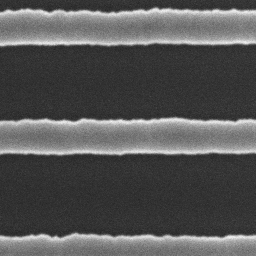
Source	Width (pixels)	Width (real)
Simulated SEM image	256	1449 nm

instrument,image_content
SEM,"lines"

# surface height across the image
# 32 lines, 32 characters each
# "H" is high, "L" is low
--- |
LLLLLLLLLLLLLLLLLLLLLLLLLLLLLLLL
HHHHHHHHHHHHLLLHHHHHHHHHHHHHHHHH
HHHHHHHHHHHHHHHHHHHHHHHHHHHHHHHH
HHHHHHHHHHHHHHHHHHHHHHHHHHHHHHHH
HHHHHHHHHHHHHHHHHHHHHHHHHHHHHHHH
HHHLHHHLHLLLHHHHHLLLLLLLLLHLLLLL
LLLLLLLLLLLLLLLLLLLLLLLLLLLLLLLL
LLLLLLLLLLLLLLLLLLLLLLLLLLLLLLLL
LLLLLLLLLLLLLLLLLLLLLLLLLLLLLLLL
LLLLLLLLLLLLLLLLLLLLLLLLLLLLLLLL
LLLLLLLLLLLLLLLLLLLLLLLLLLLLLLLL
LLLLLLLLLLLLLLLLLLLLLLLLLLLLLLLL
LLLLLLLLLLLLLLLLLLLLLLLLLLLLLLLL
LLLLLLLLLLLLLLLLLLLLLLLLLLLLLLLL
LLLLLLLLLLLLLLLLLLLLLLLLLLLLLLLL
HHHHHHHHHHHHHHHHHHHHHHHHHHHHHHHH
HHHHHHHHHHHHHHHHHHHHHHHHHHHHHHHH
HHHHHHHHHHHHHHHHHHHHHHHHHHHHHHHH
HHHHHHHHHHHHHHHHHHHHHHHHHHHHHHHH
LLLLLLLLLLLLLLLLLLLLLLLLLLLLLLLL
LLLLLLLLLLLLLLLLLLLLLLLLLLLLLLLL
LLLLLLLLLLLLLLLLLLLLLLLLLLLLLLLL
LLLLLLLLLLLLLLLLLLLLLLLLLLLLLLLL
LLLLLLLLLLLLLLLLLLLLLLLLLLLLLLLL
LLLLLLLLLLLLLLLLLLLLLLLLLLLLLLLL
LLLLLLLLLLLLLLLLLLLLLLLLLLLLLLLL
LLLLLLLLLLLLLLLLLLLLLLLLLLLLLLLL
LLLLLLLLLLLLLLLLLLLLLLLLLLLLLLLL
LLLLLLLLLLLLLLLLLLLLLLLLLLLLLLLL
LLLLHHLLHHHHHHLLLHHLLLLLLLLLLHHL
HHHHHHHHHHHHHHHHHHHHHHHHHHHHHHHH
HHHHHHHHHHHHHHHHHHHHHHHHHHHHHHHH